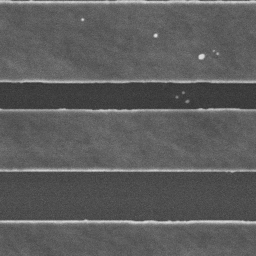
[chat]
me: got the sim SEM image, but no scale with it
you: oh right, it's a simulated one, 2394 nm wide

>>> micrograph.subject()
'lines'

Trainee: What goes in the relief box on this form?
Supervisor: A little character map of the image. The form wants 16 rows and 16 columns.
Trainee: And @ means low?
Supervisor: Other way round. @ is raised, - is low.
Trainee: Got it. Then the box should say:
@@@@@@@@@@@@@@@@
@@@@@@@@@@@@@@@@
@@@@@@@@@@@@@@@@
@@@@@@@@@@@@@@@@
@@@@@@@@@@@@@@@@
----------------
----------------
@@@@@@@@@@@@@@@@
@@@@@@@@@@@@@@@@
@@@@@@@@@@@@@@@@
@@@@@@@@@@@@@@@@
----------------
----------------
----------------
@@@@@@@@@@@@@@@@
@@@@@@@@@@@@@@@@